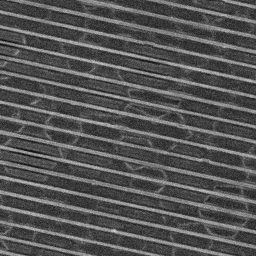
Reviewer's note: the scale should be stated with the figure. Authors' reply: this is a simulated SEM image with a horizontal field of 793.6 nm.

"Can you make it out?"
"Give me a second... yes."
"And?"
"parallel lines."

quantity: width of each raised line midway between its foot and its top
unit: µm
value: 0.0083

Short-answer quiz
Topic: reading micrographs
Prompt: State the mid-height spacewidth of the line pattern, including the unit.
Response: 11.6 px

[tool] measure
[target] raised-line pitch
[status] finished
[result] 45.5 nm